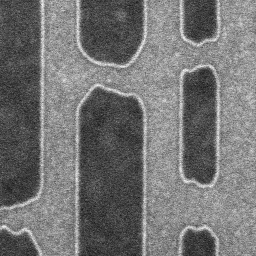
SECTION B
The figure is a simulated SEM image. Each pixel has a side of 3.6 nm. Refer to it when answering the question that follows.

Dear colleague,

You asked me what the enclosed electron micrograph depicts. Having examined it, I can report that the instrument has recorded one or a few lines or trenches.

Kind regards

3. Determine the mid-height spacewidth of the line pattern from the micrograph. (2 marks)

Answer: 34.2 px